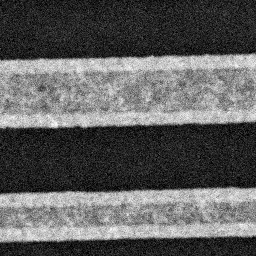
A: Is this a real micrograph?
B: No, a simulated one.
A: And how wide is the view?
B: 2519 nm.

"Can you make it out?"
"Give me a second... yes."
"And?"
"one or a few lines or trenches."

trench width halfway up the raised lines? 766 nm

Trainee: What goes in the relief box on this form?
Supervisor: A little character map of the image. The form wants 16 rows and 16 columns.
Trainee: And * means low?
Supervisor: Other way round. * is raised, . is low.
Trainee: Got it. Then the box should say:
................
................
................
................
****************
****************
****************
*******.........
................
................
................
................
****************
****************
**********......
................